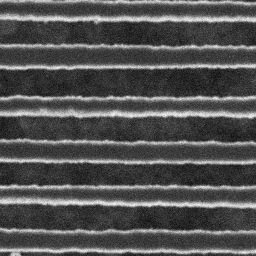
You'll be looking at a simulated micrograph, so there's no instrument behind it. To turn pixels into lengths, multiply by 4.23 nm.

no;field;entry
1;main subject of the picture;lines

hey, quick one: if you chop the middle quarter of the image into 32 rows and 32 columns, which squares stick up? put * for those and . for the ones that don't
********************************
................................
................................
................................
................................
................................
................................
................................
*********..**********.*******.**
********************************
********************************
********************************
********************************
................................
................................
................................
................................
................................
................................
*************.....***.......***.
********************************
********************************
********************************
********************************
.*..*.**.**.********************
................................
................................
................................
................................
................................
**.......*........*..*.*...*....
********************************